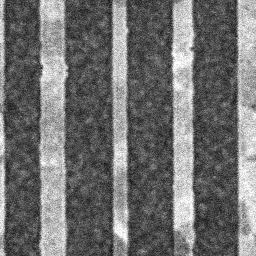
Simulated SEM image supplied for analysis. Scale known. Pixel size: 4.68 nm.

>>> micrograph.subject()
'one or a few lines or trenches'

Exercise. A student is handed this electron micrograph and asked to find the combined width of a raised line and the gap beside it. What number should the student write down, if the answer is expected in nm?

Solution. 304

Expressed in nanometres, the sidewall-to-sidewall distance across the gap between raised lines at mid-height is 225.